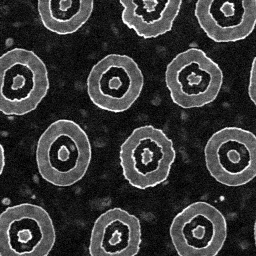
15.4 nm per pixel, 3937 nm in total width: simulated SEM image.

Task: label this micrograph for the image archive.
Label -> ring-shaped raised bodies with a dot in the middle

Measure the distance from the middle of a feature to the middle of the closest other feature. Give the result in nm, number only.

1230